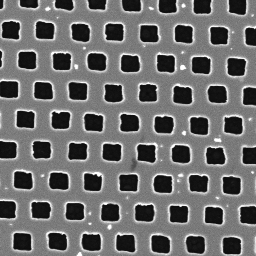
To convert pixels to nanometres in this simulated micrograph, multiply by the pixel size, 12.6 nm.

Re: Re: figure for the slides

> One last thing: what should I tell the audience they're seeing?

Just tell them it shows a regular array of holes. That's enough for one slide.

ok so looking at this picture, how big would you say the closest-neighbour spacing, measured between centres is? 425 nm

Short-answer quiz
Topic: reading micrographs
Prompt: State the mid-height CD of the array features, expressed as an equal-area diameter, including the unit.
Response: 0.244 micrometres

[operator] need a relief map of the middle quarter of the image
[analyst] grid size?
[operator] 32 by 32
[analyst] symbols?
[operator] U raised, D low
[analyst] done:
DDUUUUDDDDDUUUDDDDDUUUUDDDDDUUUU
DUUUUUUDUDUUUUDDDDDUUUUUDDDDUUUU
UUUUUUUUUUUUUUUUUUUUUUUUUUUUUUUU
UUUUUUUUUUUUUUUUUUUUUUUUUUUUUUUU
UUUUUUUUUUUUUUUUUUUUUUUUUUUUUUUU
UDDDDDUUUUDDDDUUUUUDDDDUUUUUUUUU
UDDDDDUUUUDDDDDUUUUDDDDUUUUDDDDD
UDDDDDUUUUDDDDDUUUUDDDDUUUUDDDDD
UUDDDDUUUUDDDDDUUUUDDDDUUUUDDDDD
UUUUUUUUUUUDDDUUUUUUDDUUUUUUDDDD
UUUUUUUUUUUUUUUUUUUUUUUUUUUUUUUU
UUUUUUUUUUUUUUUUUUUUUUUUUUUUUUUU
DDUUUUUUUUUUUUUUUUUUUUUUUUUUUUUU
DUUUUDDDDDUUUUDDDDUUUUUDDDDUUUUU
DUUUUDDDDDUUUUDDDDDUUUDDDDDUUUUD
DUUUUDDDDDUUUUDDDDDUUUDDDDDUUUUD
UUUUUUDDDUUUUUDDDDUUUUUDDDDUUUUU
UUUUUUUUUUUUUUUUUUUUUUUUUUUUUUUU
UUUUUUUUUUUUUUUUUUUUUUUUUUUUUUUU
UUUUUUUUUUUUUUUUUUUUUUUUUUUUUUUU
UDDDDDUUUUDDDDUUUUDDDDDUUUUUDDDU
UDDDDDUUUUDDDDDUUUDDDDDUUUUDDDDD
UDDDDDUUUUDDDDUUUUDDDDDUUUUDDDDU
UDDDDUUUUUDDDDUUUUDDDDDUUUUDDDDD
UUUUUUUUUUUUUUUUUUUUUUUUUUUUDDDU
UUUUUUUUUUUUUUUUUUUUUUUUUUUUUUUU
UUUUUUUUUUUUUUUUUUUUUUUUUUUUUUUU
DUUUUDDUUUUUUUUUDDUUUUUUUUUUUUUU
DUUUUDDDDUUUUUDDDDDUUUUDDDDUUUUD
DUUUUDDDDDUUUUDDDDDUUUDDDDDUUUUD
DUUUUDDDDDUUUUDDDDDUUUUDDDDUUUUD
UUUUUUDDDUUUUUDDDDUUUUUDDDDUUUUU